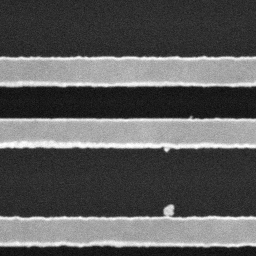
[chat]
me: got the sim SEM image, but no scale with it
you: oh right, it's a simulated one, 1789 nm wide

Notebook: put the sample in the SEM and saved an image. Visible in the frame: lines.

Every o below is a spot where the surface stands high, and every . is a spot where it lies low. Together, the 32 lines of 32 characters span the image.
................................
................................
................................
................................
................................
................................
................................
oooooooooooooooooooooooooooooooo
oooooooooooooooooooooooooooooooo
oooooooooooooooooooooooooooooooo
oooooooooooooooooooooooooooooooo
................................
................................
................................
................................
oooooooooooooooooooooooooooooooo
oooooooooooooooooooooooooooooooo
oooooooooooooooooooooooooooooooo
......................o.o.......
................................
................................
................................
................................
................................
................................
................................
................................
oooooooooooooooooooooooooooooooo
oooooooooooooooooooooooooooooooo
oooooooooooooooooooooooooooooooo
oooooooooooooooooooooooooooooooo
................................